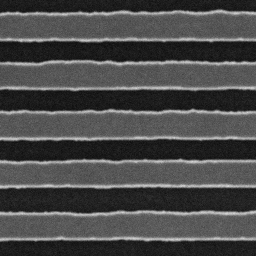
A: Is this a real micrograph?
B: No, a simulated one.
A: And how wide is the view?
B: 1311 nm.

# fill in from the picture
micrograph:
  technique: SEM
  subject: lines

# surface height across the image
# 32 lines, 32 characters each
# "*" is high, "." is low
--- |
................................
..............**.*..****..*****.
********************************
********************************
********************************
................................
................................
................................
********************************
********************************
********************************
................................
................................
................................
********************************
********************************
********************************
...........*....................
................................
................................
********************************
********************************
********************************
................................
................................
................................
.................***...........*
********************************
********************************
********************************
................................
................................